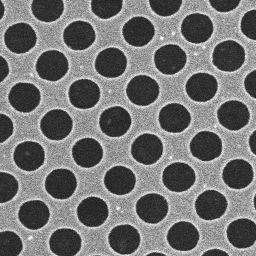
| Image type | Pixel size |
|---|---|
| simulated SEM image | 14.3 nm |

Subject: a regular array of holes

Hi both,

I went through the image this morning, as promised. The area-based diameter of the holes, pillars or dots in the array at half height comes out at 31.6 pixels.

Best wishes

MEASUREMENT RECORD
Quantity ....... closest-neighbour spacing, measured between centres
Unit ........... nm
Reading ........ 592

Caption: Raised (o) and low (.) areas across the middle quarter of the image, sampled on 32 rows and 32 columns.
.ooooooo........ooooooo.......oo
.ooooooo.......ooooooooo.....ooo
.oooooooo......oooooooooo...oooo
ooooooooooo..oooo.....ooooooooo.
oo......oooooooo.......oooooooo.
oo.......ooooooo........oooooo..
o........oooooo.........oooooo..
o........ooooooo........ooooooo.
o........ooooooo.......ooooooooo
oo.......oooooooo.....oooooooooo
oo......ooooo.ooooo.ooooo.....oo
oooooooooo.....ooooooooo.......o
.oooooooo.......oooooooo.......o
..ooooooo........ooooooo........
..ooooooo........ooooooo........
..ooooooo........ooooooo.......o
..ooooooo.......ooooooooo.....oo
.ooooooooo.....ooooo..oooooooooo
ooooo..ooooooooooo......oooooooo
ooo......oooooooo........ooooooo
oo.......oooooooo........oooooo.
oo........ooooooo........oooooo.
oo........ooooooo........ooooooo
oo........ooooooo.......oooooooo
ooo......ooooooooo.....ooooo.ooo
oooo....oooo...ooooooooooo.....o
.oooooooooo......oooooooo.......
...ooooooo.......oooooooo.......
...ooooooo........oooooo........
...ooooooo........ooooooo.......
...ooooooo........ooooooo.......
...oooooooo......ooooooooo.....o